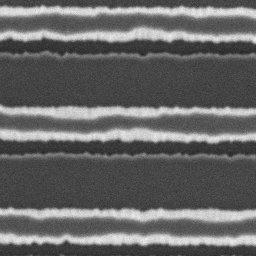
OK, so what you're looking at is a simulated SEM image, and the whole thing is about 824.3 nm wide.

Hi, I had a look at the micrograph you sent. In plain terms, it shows lines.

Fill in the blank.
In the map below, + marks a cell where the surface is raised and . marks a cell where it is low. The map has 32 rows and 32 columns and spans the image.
................................
++++++++++++++++++++++++++++++++
++++++++++++++++++++++++++++++++
++++++++++++++++++++++++++++++++
+++++++++++++++++.++++++++++++++
................................
................................
................................
................................
................................
................................
................................
................................
+...............................
++++++++++++++++++++++++++++++++
++++++++++++++++++++++++++++++++
++++++++++++++++++++++++++++++++
.......................+.+++....
................................
................................
................................
................................
................................
................................
................................
................................
+++++++++++++++++..++.+++......+
++++++++++++++++++++++++++++++++
++++++++++++++++++++++++++++++++
++++++++++++++++++++++++++++++++
................................
................................